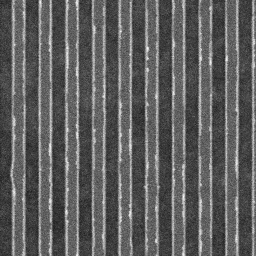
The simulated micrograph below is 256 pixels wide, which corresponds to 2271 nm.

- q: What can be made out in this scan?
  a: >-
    parallel lines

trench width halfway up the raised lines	120	nm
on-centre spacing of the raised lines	0.236	µm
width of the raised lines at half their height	112	nm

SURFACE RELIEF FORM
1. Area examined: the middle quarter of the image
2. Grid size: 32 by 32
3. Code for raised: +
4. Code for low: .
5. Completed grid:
++++...+++....+++....++....+++..
+++....+++....+++....++....+++..
+++....+++....+++....++....+++..
+++....+++....+++....++....+++..
+++....+++....+++....++....+++..
++++...+++....+++....++....+++..
++++...+++....+++....++....+++..
++++...+++....+++....++....+++..
++++...+++....+++....++....+++..
++++...+++....+++....++....+++..
++++...+++....+++....++....+++..
+++....+++....+++....++....+++..
+++....+++....+++....++....+++..
+++....+++....+++....++....+++..
++++...+++....+++....++....+++..
++++...+++....+++....++....+++..
++++...+++....+++....++....+++..
++++...+++....+++....++....+++..
++++...+++....+++....++....+++..
++++...+++....+++....++....+++..
++++...+++....+++....++....+++..
++++...+++....+++....++....+++..
++++...+++....+++....++....+++..
++++...+++....+++....++....+++..
++++...+++....+++....++....+++..
++++...+++....+++....++....+++..
++++...+++....+++....++....+++..
+++....+++....+++....++....+++..
+++....+++....+++....++....+++..
+++....+++....+++....++....+++..
++++...+++....+++...++++...+++..
++++...+++....+++....++....+++..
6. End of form